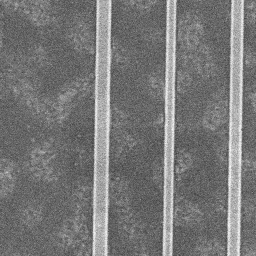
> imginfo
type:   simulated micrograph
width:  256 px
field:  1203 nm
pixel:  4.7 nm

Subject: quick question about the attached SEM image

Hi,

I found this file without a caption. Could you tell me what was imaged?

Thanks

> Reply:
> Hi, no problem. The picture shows one or a few lines or trenches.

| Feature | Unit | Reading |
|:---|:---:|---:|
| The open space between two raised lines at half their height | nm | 268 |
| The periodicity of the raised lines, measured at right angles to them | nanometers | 314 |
